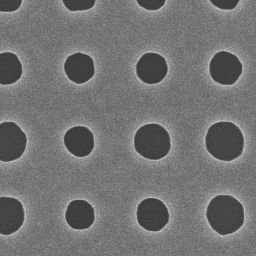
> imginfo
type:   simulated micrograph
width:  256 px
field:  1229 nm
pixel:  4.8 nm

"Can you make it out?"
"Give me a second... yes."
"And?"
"a regular array of holes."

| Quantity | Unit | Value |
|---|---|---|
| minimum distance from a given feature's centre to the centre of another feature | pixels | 72.6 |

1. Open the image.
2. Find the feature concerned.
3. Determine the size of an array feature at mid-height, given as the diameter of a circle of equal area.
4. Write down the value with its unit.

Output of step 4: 157 nm